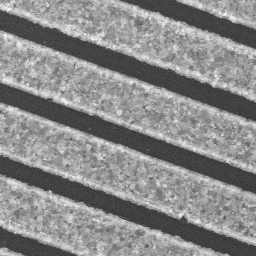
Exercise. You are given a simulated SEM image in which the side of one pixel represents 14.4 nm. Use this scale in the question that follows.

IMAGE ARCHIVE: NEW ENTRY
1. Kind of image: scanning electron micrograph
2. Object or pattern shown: one or a few lines or trenches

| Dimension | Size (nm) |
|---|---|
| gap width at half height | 376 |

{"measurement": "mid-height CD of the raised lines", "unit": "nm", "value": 598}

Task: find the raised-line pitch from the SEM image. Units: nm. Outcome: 982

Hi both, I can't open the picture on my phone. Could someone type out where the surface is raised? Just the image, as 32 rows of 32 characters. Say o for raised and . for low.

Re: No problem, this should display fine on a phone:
ooooooooooooooo..........ooooooo
..oooooooooooooooo.........ooooo
.....ooooooooooooooo..........oo
........ooooooooooooooo.........
o.........oooooooooooooooo......
ooo..........oooooooooooooooo...
oooooo..........oooooooooooooooo
ooooooooo..........ooooooooooooo
oooooooooooo..........oooooooooo
ooooooooooooooo..........ooooooo
..ooooooooooooooo..........ooooo
.....ooooooooooooooo..........oo
........ooooooooooooooo.........
o.........oooooooooooooooo......
ooo..........ooooooooooooooo....
oooooo..........ooooooooooooooo.
ooooooooo..........ooooooooooooo
ooooooooooo..........ooooooooooo
ooooooooooooooo.........oooooooo
..ooooooooooooooo..........ooooo
....oooooooooooooooo..........oo
........ooooooooooooooo.........
o.........oooooooooooooooo......
ooo..........ooooooooooooooo....
oooooo..........ooooooooooooooo.
ooooooooo..........ooooooooooooo
oooooooooooo.........ooooooooooo
ooooooooooooooo.........oooooooo
..oooooooooooooooo.........ooooo
....oooooooooooooooo..........oo
.......oooooooooooooooo.........
..........ooooooooooooooo.......